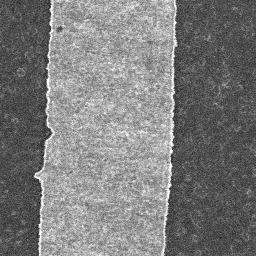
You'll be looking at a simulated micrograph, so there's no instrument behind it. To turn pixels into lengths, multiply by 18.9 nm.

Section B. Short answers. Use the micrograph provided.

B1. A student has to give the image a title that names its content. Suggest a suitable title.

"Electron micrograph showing one or a few lines or trenches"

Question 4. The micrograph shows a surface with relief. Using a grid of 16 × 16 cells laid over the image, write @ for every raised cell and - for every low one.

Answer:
---@@@@@@@@-----
---@@@@@@@@-----
---@@@@@@@@-----
---@@@@@@@@-----
---@@@@@@@@-----
---@@@@@@@@-----
---@@@@@@@@-----
---@@@@@@@@-----
---@@@@@@@@-----
---@@@@@@@@-----
---@@@@@@@@-----
---@@@@@@@@-----
---@@@@@@@@-----
---@@@@@@@------
--@@@@@@@@------
--@@@@@@@@------